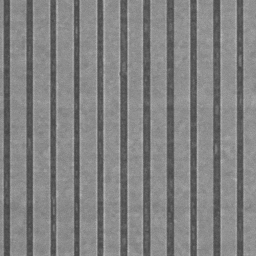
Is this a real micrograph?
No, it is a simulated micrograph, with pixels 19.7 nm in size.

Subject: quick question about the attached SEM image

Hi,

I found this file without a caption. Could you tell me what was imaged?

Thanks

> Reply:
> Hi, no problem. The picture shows parallel lines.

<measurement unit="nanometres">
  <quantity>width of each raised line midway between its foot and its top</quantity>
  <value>315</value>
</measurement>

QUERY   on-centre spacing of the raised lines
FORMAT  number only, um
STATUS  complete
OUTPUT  0.461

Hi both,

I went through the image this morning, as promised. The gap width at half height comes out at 148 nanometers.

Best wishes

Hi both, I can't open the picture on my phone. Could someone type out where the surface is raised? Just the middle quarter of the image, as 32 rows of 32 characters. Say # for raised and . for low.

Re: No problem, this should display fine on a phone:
##..####..####..####..####..###.
##..####..####..####..####..###.
##..####..####..####..####..###.
##..####..####..####..####..###.
##..####..####..####..####..###.
##..####..####..####..####..###.
##..####..####..####..####..###.
##..####..####..####..####..###.
##..####..####..####..####..###.
##..####..####..####..####..###.
##..####..####..####..####..###.
##..####..####..####..####..###.
##..####..####..####..####..###.
##..####..####..####..####..###.
##..####..####..####..####..###.
##..####..####..####..####..###.
##..####..####..####..####..###.
##..####..####..####..####..###.
##..####..####..####..####..###.
##..####..####..####..####..###.
##..####..####..####..####..###.
##..####..####..####..####..###.
##..####..####..####..####..###.
##..####..####..####..####..###.
##..####..####..####..####..###.
##..####..####..####..####..###.
##..####..####..####..####..###.
##..####..####..####..####..###.
##..####..####..####..####..###.
##..####..####..####..####..###.
##..####..####..####..####..###.
##..####..####..####..####..###.